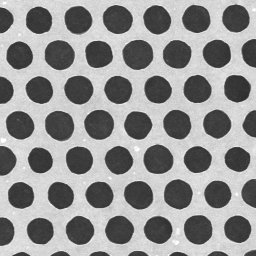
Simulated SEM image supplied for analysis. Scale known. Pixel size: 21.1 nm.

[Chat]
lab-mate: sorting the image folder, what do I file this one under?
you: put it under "a regular array of holes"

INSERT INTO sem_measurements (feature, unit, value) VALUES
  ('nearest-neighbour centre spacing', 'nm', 830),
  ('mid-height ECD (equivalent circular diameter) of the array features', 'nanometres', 591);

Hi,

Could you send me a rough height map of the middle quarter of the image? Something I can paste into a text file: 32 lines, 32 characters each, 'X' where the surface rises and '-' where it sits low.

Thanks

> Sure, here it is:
--XXXX----XXXXXX-----XXXXX-----X
XXXXXXXXXXXXXXXXXX-XXXXXXXXXXXXX
XXXXXXXXXXXXXXXXXXXXXXXXXXXXXXXX
X-----XXXXXX---XXXXXXX---XXXXXX-
X------XXXX-----XXXX------XXXX--
-------XXX-------XXX-------XXX--
-------XXX-------XXX-------XXX--
-------XXX-------XXX-------XXX--
X------XXXX------XXXX-----XXXXX-
XX----XXXXXX----XXXXXX---XXXXXXX
XXXXXXXXXXXXXXXXXXXXXXXXXXXXXXXX
XXXXXXXX--XXXXXXXXXXXXXXXXXX-XXX
-XXXXX------XXXX----XXXXXX----XX
--XXX-------XXX------XXXX------X
--XXX--------XX-------XXX-------
---XX--------XX-------XXX-------
---XX-------XXX-------XXX-------
--XXXX------XXXX-----XXXXX-----X
-XXXXXX----XXXXXX---XXXXXXX---XX
XXXXXXXXXXXXXXXXXXXXXXXXXXXXXXXX
XXXXXXXXXXXXXXXXXXXXXX---XXXXXXX
X-----XXXXX-----XXXXX-----XXXXX-
X------XXX-------XXX-------XXX--
-------XXX-------XXX-------XXX--
-------XXX-------XXX-------XXX--
X------XXX-------XXX-------XXXX-
X-----XXXXX-----XXXXX-----XXXXX-
XXX--XXXXXXXX--XXXXXXXX-XXXXXXXX
XXXXXXXXXXXXXXXXXXXXXXXXXXXXXXXX
XXXXXXXX--XXXXXXX---XXXXXXX----X
-XXXXX-----XXXXX-----XXXX-------
--XXXX------XXX-------XXX-------